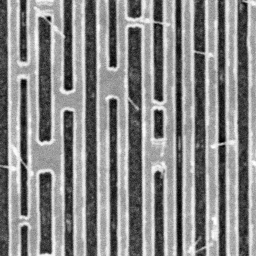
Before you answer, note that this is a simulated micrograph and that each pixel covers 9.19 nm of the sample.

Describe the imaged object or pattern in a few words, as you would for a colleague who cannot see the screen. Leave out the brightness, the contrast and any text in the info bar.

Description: parallel lines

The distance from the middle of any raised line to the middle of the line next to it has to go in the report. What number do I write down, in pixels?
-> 21.7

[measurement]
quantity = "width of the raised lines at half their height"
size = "97.6 nanometres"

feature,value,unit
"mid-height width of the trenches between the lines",0.106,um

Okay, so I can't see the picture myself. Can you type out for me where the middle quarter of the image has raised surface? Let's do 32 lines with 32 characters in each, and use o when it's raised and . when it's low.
..ooo....oo..ooo....oo...oo...oo
..ooo....oooooo.....oo...oo...oo
..ooo....oooooo.....oo...oo...oo
..ooo....oooooo.....oo...oo...oo
..ooo....oooooo.....oo...oo...oo
...oo....ooooooo....oo...oo...oo
..ooo....ooooooo....oo...oo...oo
ooooo....ooooooo....oo...oo...oo
ooooo...ooo..ooo....oo...oo...oo
ooooo...ooo...oo....ooo..oo...oo
ooooo...ooo...oo....ooooooo...oo
.oooo...ooo...oo....oo...oo...oo
...oo...ooo...oo....oo...oo...oo
...oo...ooo...oo....oo...oo...oo
...oo...ooo...oo....oo...oo...oo
...oo...ooo...oo....oo...oo...oo
...oo...ooo...oo....oo...oo...oo
...oo...ooo...oo....oo...ooo..oo
...oo...ooo...oo....oo...ooo..oo
...oo...ooo...oo....oooooooo..oo
...oo...ooo...oo....oooooooo..oo
...oo....oo...oo....oooooooo..oo
...oo....oo...oo....oooooooo..oo
...oo....oo...oo....oooooooo..oo
...oo....oo...oo....oooooooo..oo
...oo....oo...oo....oooooooo..oo
...oo....oo...oo....ooo.oooo..oo
...oo....oo...oo....oo...ooo..oo
...oo....oo...oo....oo...ooo..oo
...oo....oo...oo....oo...ooo..oo
...oo....oo...oo....oo...ooo..oo
...oo....oo...oo....oo...ooo..oo